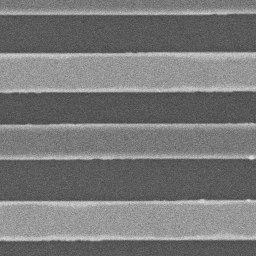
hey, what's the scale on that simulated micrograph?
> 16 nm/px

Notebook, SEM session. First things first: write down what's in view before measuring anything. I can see lines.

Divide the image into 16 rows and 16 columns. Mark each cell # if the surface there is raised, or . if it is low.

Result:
################
................
................
################
################
################
................
................
################
################
................
................
...............#
################
################
................